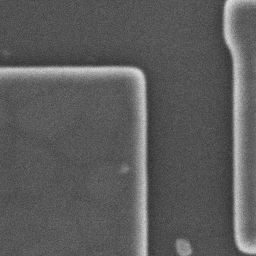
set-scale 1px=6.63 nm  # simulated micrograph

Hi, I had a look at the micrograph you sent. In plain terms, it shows wiring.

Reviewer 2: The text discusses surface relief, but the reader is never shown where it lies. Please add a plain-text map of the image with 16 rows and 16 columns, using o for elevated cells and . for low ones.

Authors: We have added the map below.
..............oo
..............oo
..............oo
..............oo
ooooooooo......o
ooooooooo......o
ooooooooo......o
ooooooooo......o
ooooooooo......o
ooooooooo......o
ooooooooo......o
ooooooooo......o
ooooooooo......o
ooooooooo......o
ooooooooo......o
ooooooooo......o